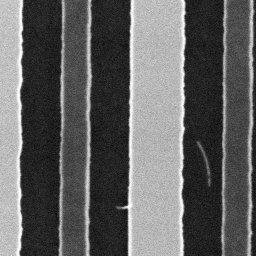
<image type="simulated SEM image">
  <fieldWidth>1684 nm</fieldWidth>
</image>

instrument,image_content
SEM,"lines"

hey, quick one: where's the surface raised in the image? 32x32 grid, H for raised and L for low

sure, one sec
HHHLLLLLHHHLLLLLHHHHHHHLLLLLHHHH
HHHLLLLLHHHLLLLLHHHHHHHLLLLLHHHH
HHHLLLLLHHHLLLLLHHHHHHHLLLLLHHHH
HHHLLLLLHHHLLLLLHHHHHHHLLLLLHHHH
HHHLLLLLHHHLLLLLHHHHHHHLLLLLHHHH
HHHLLLLLHHHLLLLLHHHHHHHLLLLLHHHH
HHHLLLLLHHHLLLLLHHHHHHHLLLLLHHHL
HHHLLLLLHHHLLLLLHHHHHHHLLLLLHHHH
HHHLLLLLHHHLLLLLHHHHHHHLLLLLHHHH
HHHLLLLLHHHLLLLLHHHHHHHLLLLLHHHH
HHHLLLLLHHHLLLLLHHHHHHHLLLLLHHHL
HHLLLLLLHHHLLLLLHHHHHHHLLLLLHHHL
HHHLLLLLHHHLLLLLHHHHHHHLLLLLHHHL
HHHLLLLLHHHLLLLLHHHHHHHLLLLLHHHL
HHHLLLLLHHHLLLLLHHHHHHHLLLLLHHHL
HHHLLLLLHHHLLLLLHHHHHHHLLLLLHHHH
HHHLLLLLHHHLLLLLHHHHHHHLLLLLHHHL
HHHLLLLLHHHLLLLLHHHHHHHLLLLLHHHL
HHHLLLLLHHHLLLLLHHHHHHHLLLLLHHHL
HHLLLLLLHHHLLLLLHHHHHHHLLLLLHHHL
HHLLLLLLHHHLLLLLHHHHHHHLLLLLHHHL
HHLLLLLLHHHLLLLLHHHHHHHLLLLLHHHL
HHLLLLLLHHHLLLLLHHHHHHHLLLLLHHHL
HHHLLLLLHHHLLLLLHHHHHHHLLLLLHHHL
HHHLLLLLHHHLLLLLHHHHHHHLLLLLHHHL
HHLLLLLLHHHLLLLLHHHHHHHLLLLLHHHL
HHHLLLLLHHHLLLLLHHHHHHHLLLLLHHHL
HHHLLLLLHHHLLLLLHHHHHHHLLLLLHHHL
HHHLLLLHHHHLLLLLHHHHHHHLLLLLHHHL
HHHLLLLLHHHLLLLLHHHHHHHLLLLLHHHL
HHHLLLLLHHHLLLLLHHHHHHHLLLLLHHHL
HHLLLLLLHHHLLLLLHHHHHHHLLLLLHHHL